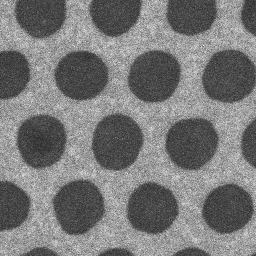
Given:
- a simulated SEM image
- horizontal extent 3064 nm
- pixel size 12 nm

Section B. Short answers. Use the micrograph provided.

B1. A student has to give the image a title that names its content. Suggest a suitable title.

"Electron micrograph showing a regular array of holes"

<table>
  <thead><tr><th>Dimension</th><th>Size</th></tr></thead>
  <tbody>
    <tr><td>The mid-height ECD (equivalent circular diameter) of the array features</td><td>0.637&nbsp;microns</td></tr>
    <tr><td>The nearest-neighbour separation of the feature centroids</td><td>0.886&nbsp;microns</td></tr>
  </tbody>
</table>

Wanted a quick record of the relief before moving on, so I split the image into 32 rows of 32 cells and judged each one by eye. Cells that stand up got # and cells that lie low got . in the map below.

##......###.......###......###..
##......###.......###......###..
##......###......####......###..
###.....####....#####.....#####.
####..#######..#################
################################
..#######..#######...######...##
....###......####.....####.....#
....###......###.......###......
....###.......##.......##.......
....###......###......###.......
...#####.....###......####.....#
.#########.#######...######...##
################################
####...######...################
###.....####.....#####.....####.
##......####......###......###..
##......####......###......###..
##......###.......###......###..
###.....####.....####......###..
###....#####.....#####....#####.
################################
##########.#####################
...#####....#####....######...##
....###......###......####.....#
....###......###......###.......
....###......###......###.......
...####......###......###......#
..######....#####....#####....##
################################
################################
###....######...######....######